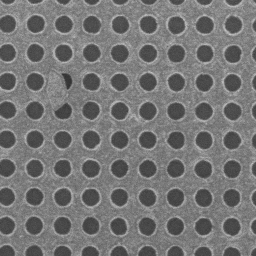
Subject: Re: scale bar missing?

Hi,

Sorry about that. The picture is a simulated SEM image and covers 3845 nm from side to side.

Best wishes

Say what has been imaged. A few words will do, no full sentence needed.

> a regular array of holes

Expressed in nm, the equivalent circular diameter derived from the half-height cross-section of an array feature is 277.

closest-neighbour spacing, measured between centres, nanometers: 422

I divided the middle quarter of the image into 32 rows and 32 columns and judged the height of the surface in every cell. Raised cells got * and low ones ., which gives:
********************************
********************************
.*****..*****..*****..*****..***
..***....***....***....***....**
..***....***....***....***....**
..***....***....***....***....**
******..*****..*****..*****..***
********************************
********************************
*****...************.***********
..***....***....***....***....**
..**.....***....***....***....**
..***....***....***....***....**
.****...****...****....***....**
********************************
********************************
******.*************************
..***....***....***....***....**
..**.....***....**.....***....**
..***....***....***....***....**
.****....***....***....****...**
******.*************************
********************************
********************************
.****...****....****..*****..***
..**.....***....***....***....**
..**.....***....***....***....**
..***....***....***....***....**
******.******..*****..*****.****
********************************
********************************
..***...****...****...****...***